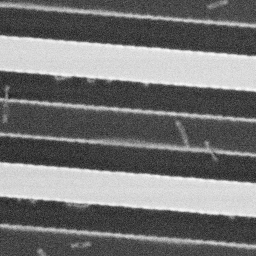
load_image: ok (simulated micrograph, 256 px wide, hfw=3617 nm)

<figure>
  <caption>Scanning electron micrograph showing lines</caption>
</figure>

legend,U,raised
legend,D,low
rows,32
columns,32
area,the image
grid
UUUUUUUUUUUUUUUUUUUUUUUUUUUUUUUU
DDDDDDDDDDDDUUUUUUUUUUUUUUUUUUUU
DDDDDDDDDDDDDDDDDDDDDDDUUUUUUUUU
DDDDDDDDDDDDDDDDDDDDDDDDDDDDDDDD
DDDDDDDDDDDDDDDDDDDDDDDDDDDDDDDD
UUUUUUUUUUUUUDDDDDDDDDDDDDDDDDDD
UUUUUUUUUUUUUUUUUUUUUUUUDDDDDDDD
UUUUUUUUUUUUUUUUUUUUUUUUUUUUUUUU
UUUUUUUUUUUUUUUUUUUUUUUUUUUUUUUU
DDDDDDDDDUUUUUUUUUUUUUUUUUUUUUUU
DDDDDDDDDDDDDDDDDDDDDDUUUUUUUUUU
DDDDDDDDDDDDDDDDDDDDDDDDDDDDDDDD
UDDDDDDDDDDDDDDDDDDDDDDDDDDDDDDD
UUUUUUUUUUUDDDDDDDDDDDDDDDDDDDDD
UUUUUUUUUUUUUUUUUUUUUUUUUDDDDDDD
UUUUUUUUUUUUUUUUUUUUUUUUUUUUUUUU
UUUUUUUUUUUUUUUUUUUUUUUUUUUUUUUU
DDDDDDDDDDUUUUUUUUUUUUUUUUUUUUUU
DDDDDDDDDDDDDDDDDDDDDDUUUUUUUUUU
DDDDDDDDDDDDDDDDDDDDDDDDDDDDDDDD
UUDDDDDDDDDDDDDDDDDDDDDDDDDDDDDD
UUUUUUUUUUUUUUDDDDDDDDDDDDDDDDDD
UUUUUUUUUUUUUUUUUUUUUUUUUUDDDDDD
UUUUUUUUUUUUUUUUUUUUUUUUUUUUUUUU
DUUUUUUUUUUUUUUUUUUUUUUUUUUUUUUU
DDDDDDDDDDDDUUUUUUUUUUUUUUUUUUUU
DDDDDDDDDDDDDDDDDDDDDDDDDUUUUUUU
DDDDDDDDDDDDDDDDDDDDDDDDDDDDDDDD
UUUDDDDDDDDDDDDDDDDDDDDDDDDDDDDD
UUUUUUUUUUUUUUUDDDDDDDDDDDDDDDDD
UUUUUUUUUUUUUUUUUUUUUUUUUUUUDDDD
UUUUUUUUUUUUUUUUUUUUUUUUUUUUUUUU